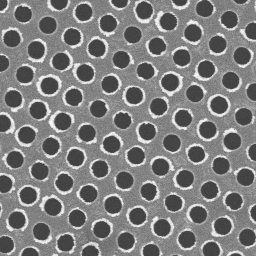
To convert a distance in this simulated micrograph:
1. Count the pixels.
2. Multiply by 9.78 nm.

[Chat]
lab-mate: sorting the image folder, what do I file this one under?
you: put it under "a regular array of holes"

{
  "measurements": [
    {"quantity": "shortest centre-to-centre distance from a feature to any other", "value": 263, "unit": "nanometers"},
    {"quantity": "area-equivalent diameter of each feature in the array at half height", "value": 169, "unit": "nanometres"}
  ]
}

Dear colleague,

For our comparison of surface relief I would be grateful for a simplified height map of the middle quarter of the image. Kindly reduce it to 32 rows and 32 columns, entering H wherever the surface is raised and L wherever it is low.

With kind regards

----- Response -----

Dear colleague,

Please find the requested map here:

LHHHLLHHHHHHHLLLHHHLLLHHHHHHHLHH
HHHLLLLHHHHHHHHHHHLLLLLHHHHHHHHH
HHHLLLLLHHHHHHHHHHLLLLLHHHLHHHHH
HHHHLLLHHHLLLHHHHHHHLLHHHLLLLHHH
HHHHHHHHHLLLLLHHHHHHHHHHLLLLLHHH
HHHHHHHHHLLLLLHHHHHHHHHHHLLLLHHH
HLLLHHHHHHLLLHHHLLLHHHHHHHLLHHHL
LLLLHHHHHHHHHHHLLLLLHHHHHHHHHHLL
LLLLLHHHHHHHHHHLLLLLHHHHHHHHHHHL
HLLLHHHLLLHHHHHHLLLHHHLLLHHHHHHH
HHHHHHHLLLHHHHHHHHHHHHLLLLHHHHHH
HHHHHHHLLLLHHHHHHHHHHHLLLLHHHLHH
LHHHHHHLLLHHHLLLHHHHHHHLLHHHLLLH
LLHHHHHHHHHHHLLLLHHHHHHHHHHHLLLL
LLHHHHHHHHHHHLLLLHHHHHHHHHHHLLLL
LLHHHLLHHHHHHLLLHHHLLLHHHHHHHLLH
HHHHLLLLHHHHHHHHHHHLLLLHHHHHHHHH
HHHHLLLLHHHHHHHHHHHLLLLHHHHHHHHH
HHHHLLLLHHLLLHHHHHHHLLHHHLLLLHHH
HHHHHHHHHHLLLLHHHHHHHHHHHLLLLHHH
HHHHHHHHHHLLLLHHHHHHHHHHHLLLLHHH
HHLLHHHHHHLLLLHHLLLLHHHHHHLLHHHL
HLLLLHHHHHHHHHHHLLLLHHHHHHHHHHHL
HLLLLHHHHHHHHHHHLLLLHHHHHHHHHHHL
HLLLLHHHLLHHHHHHLLLLHHLLLLHHHHHH
HHLLHHHLLLLHHHHHHHHHHHLLLLHHHHHH
HHHHHHHLLLLHHHHHHHHHHHLLLLHHHHLH
LHHHHHHLLLLHHLLLHHHHHHHLLHHHLLLL
LLHHHHHHHHHHHLLLLHHHHHHHHHHHLLLL
LLHHHHHHHHHHHLLLLHHHHHHHHHHHLLLL
LLHHHLLHHHHHHHLLLHHHLLLHHHHHHLLH
LHHHLLLLHHHHHHHHHHHLLLLHHHHHHHHH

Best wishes